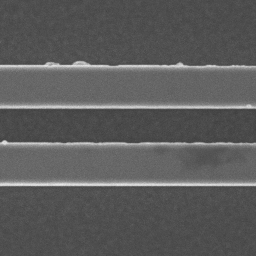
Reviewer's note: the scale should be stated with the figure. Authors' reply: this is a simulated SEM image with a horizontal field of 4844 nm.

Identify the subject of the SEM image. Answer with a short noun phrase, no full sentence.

lines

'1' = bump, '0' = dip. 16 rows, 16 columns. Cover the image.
0000000000000000
0000000000000000
0000000000000000
0000000000000000
1111111111111111
1111111111111111
1111111111111111
0000000000000000
0000000000000000
1111111111111111
1111111111111111
1111111111111111
0000000000000000
0000000000000000
0000000000000000
0000000000000000